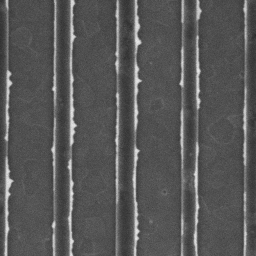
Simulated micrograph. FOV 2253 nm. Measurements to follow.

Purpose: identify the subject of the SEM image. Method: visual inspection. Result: parallel lines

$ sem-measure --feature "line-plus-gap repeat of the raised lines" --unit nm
556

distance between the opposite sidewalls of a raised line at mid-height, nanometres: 168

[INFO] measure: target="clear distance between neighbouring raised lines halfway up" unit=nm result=389